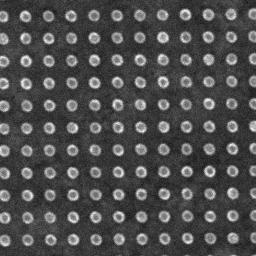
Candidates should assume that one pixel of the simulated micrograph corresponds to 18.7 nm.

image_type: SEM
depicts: a regular array of raised bodies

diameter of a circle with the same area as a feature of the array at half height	188	nanometers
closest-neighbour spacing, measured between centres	22.1	px